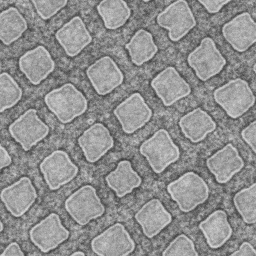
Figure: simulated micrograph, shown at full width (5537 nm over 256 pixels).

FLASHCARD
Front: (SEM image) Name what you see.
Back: a regular array of raised bodies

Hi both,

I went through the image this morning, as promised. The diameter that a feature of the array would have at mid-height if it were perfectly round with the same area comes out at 704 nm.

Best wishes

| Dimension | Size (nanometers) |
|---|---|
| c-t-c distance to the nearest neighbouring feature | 995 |